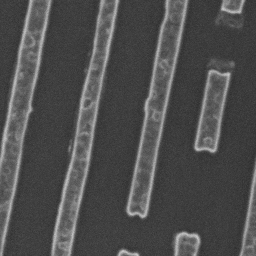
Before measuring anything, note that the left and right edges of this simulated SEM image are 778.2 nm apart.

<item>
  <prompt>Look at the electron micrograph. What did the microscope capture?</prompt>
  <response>one or a few lines or trenches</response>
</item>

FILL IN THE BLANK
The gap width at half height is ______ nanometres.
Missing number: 149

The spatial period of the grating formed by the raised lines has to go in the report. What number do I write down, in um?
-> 0.198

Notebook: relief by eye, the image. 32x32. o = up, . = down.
....oo.......oo......oo.....oo..
....oo......oo.......oo......o..
...ooo......oo.......oo.........
...ooo......oo......ooo.........
...oo.......oo......ooo.........
...oo.......oo......oo..........
..ooo.......oo......oo..........
..ooo......oo......ooo..........
..ooo......oo......ooo..........
..ooo......oo......ooo....ooo...
..oo.......oo......oo.....ooo...
..oo......oo.......oo.....oo....
.ooo......oo......ooo.....oo....
.ooo......oo......ooo....ooo....
.ooo......oo......ooo....ooo....
.oo.......oo......oo.....ooo....
.oo.......oo......oo.....oo.....
ooo......oo.......oo.....oo.....
ooo......oo.......oo.....oo.....
ooo......oo......ooo............
oo.......oo......oo.............
oo.......oo......oo.............
oo......ooo......oo.............
oo......oo......ooo.............
oo......oo......ooo............o
o.......oo......ooo............o
o.......oo......oo.............o
o......oo......................o
o......oo......................o
o......oo.............ooo......o
.......oo.............ooo.....oo
.......oo......o......ooo.....oo